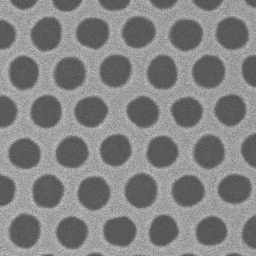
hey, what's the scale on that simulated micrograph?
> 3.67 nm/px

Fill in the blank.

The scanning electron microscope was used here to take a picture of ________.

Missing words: a regular array of holes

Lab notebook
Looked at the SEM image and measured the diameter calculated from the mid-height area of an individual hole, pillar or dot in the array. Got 116 nm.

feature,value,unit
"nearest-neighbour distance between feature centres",162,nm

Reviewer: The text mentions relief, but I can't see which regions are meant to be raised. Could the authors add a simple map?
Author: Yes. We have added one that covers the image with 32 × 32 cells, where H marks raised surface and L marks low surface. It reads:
HHLLHHHLLLHHHLLLHHHLLLHHLLLLHHHL
HHHHHHHHHHHHHHHHHHHHHHHHHHHHHHHH
HHHHHLLHHHHLLHHHLLHHHHHHHHHHLLHH
LLHHLLLLHHLLLHHLLLLHHHLLLHHLLLLH
LLHHLLLLHHLLLHHLLLLHHLLLLHHLLLLH
LLHHLLLHHHLLLHHHLLLHHHLLLHHHLLLH
HHHHHHHHHHHHHHHHHHHHHHHHHHHHHHHH
HHLLHHHHLLHHHLLLHHHLLLHHHLLLHHHL
HLLLLHHLLLLHHLLLHHLLLLHHLLLLHHLL
HLLLLHHLLLLHHLLLHHLLLLHHLLLLHHLL
HHLLHHHLLLHHHLLLHHHLLLHHHLLLHHHL
HHHHHHHHHHHHHHHHHHHHHHHHHHHHHHHH
LHHHLLLHHHLLLHHHHLLHHHLLHHHLLLHH
LLHHLLLLHLLLLHHHLLLLHLLLLHHLLLLH
LLHHLLLLHLLLLHHHLLLLHHLLLHHLLLLH
LHHHLLLHHHLLHHHHHLLHHHLLHHHHLLHH
HHHHHHHHHHHHHHHHHHHHHHHHHHHHHHHH
HHLLHHHHLLHHHLLLHHHLLLHHHLLHHHHL
HLLLLHHLLLLHHLLLHHLLLLHHLLLLHHLL
HLLLLHHLLLLHHLLLHHLLLLHHLLLLHHLL
HHLLLHHHLLHHHLLHHHHLLHHHHLLHHHHL
HHHHHHHHHHHHHHHHHHHHHHHHHHHHHHHH
LHHHHLLHHHHLLHHHLLLHHHLLLHHHLLLH
LLHHLLLLHHLLLLHHLLLLHHLLLHHLLLLH
LLHHLLLLHHLLLLHHLLLHHHLLLHHHLLLH
LHHHHLLHHHLLLHHHLLLHHHLLHHHHHHHH
HHHHHHHHHHHHHHHHHHHHHHHHHHHHHHHH
HHLLLHHHLLHHHHLLHHHLLLHHHLLLHHHL
HLLLLHHLLLLHHLLLLHHLLLHHHLLLHHLL
HLLLLHHLLLLHHLLLLHHLLLHHHLLLHHLL
HHLLHHHHLLHHHHLLHHHLLHHHHLLHHHHL
HHHHHHHHHHHHHHHHHHHHHHHHHHHHHHHH